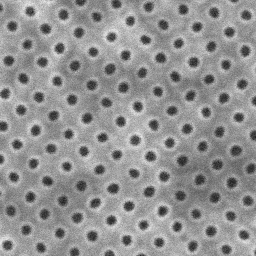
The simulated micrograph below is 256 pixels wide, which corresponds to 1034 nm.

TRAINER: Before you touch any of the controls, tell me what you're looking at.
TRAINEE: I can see a regular array of holes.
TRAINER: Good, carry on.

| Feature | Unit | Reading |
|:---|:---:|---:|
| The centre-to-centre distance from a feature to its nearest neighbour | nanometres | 92.4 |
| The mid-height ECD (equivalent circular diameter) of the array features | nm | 44.9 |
